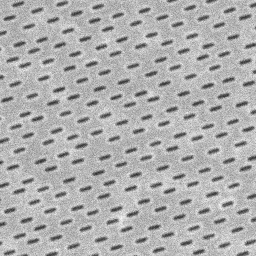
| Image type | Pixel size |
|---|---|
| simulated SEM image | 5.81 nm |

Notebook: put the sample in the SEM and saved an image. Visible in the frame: a regular array of holes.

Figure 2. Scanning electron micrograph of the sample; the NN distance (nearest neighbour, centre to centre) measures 0.0949 microns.